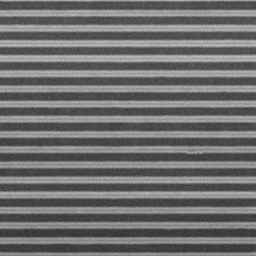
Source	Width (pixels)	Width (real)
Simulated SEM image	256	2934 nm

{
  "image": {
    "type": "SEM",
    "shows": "parallel lines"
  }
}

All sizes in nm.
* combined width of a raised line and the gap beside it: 174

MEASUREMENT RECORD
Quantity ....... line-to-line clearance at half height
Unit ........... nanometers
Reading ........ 113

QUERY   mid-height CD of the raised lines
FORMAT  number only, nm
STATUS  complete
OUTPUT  61.6